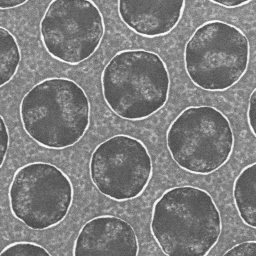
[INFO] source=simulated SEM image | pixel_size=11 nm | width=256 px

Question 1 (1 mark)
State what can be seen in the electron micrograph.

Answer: holes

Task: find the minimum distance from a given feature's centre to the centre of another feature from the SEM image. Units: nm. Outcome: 929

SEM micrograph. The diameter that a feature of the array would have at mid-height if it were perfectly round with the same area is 725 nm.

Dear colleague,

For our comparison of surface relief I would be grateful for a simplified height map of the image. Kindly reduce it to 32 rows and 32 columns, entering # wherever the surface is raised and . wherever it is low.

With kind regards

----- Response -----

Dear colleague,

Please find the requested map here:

...###......###........####...##
######......###........#########
#####........##.......##########
#####........###......###....###
..###........###########.......#
..####......###########........#
..####......###...#####........#
..######..####......###........#
..###########........##........#
..###########........###......##
.####.....###........####....###
####......###........###########
###........##........##########.
###........###......####...####.
###........####...####......###.
.##........###########.......##.
.##........##########........###
.###......####...####........###
.######.####......###........###
.###########.......###.......###
####..#####........###......####
##......###........#####..####..
##.......###.......###########..
#........###......####..#####...
#........#####...###......###...
#........##########........###..
##......###########........###..
###.....####...####.........##..
####..####......###.........####
##########.......##........#####
##..#####........###.......###..
......###........####.....##....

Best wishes